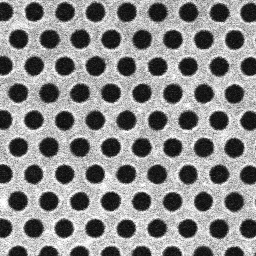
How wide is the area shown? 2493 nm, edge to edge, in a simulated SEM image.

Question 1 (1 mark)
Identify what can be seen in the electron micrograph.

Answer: a regular array of holes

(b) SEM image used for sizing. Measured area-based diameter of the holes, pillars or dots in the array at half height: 0.193 micrometres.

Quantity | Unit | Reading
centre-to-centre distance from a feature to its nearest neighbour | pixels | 30.6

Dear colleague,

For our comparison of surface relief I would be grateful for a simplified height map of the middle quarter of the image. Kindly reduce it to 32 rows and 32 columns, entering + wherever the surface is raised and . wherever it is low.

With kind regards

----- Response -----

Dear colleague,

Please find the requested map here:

...++......++.....+++.....+++...
..++++....+++.....+++.....+++...
..++++....++++...+++++...++++...
++++++++++++++++++++++++++++++++
++++++++++++++++++++++++++++++++
++....++++....++++...+++++...+++
++....+++.....+++.....+++....+++
+.....+++.....+++.....+++.....++
++....++++....+++.....+++....+++
+++..++++++..+++++..++++++..++++
++++++++++++++++++++++++++++++++
++++++++++++++++++++++++++++++++
..++++....++++...+++++...++++...
..+++.....+++.....+++.....+++...
...++.....+++.....+++.....++....
..++++....+++.....+++....++++...
.++++++..+++++...+++++..++++++..
++++++++++++++++++++++++++++++++
+++..++++++..++++++.++++++..++++
++....++++....+++.....+++....+++
+.....+++.....+++.....+++.....++
++....+++.....+++.....+++.....++
++....++++....++++...++++....+++
++++++++++++++++++++++++++++++++
++++++++++++++++++++++++++++++++
.++++++..+++++...+++++..++++++..
..+++.....+++.....+++....++++...
...++.....+++.....+++.....++....
..+++.....+++.....+++.....+++...
..++++...+++++...+++++...++++...
++++++++++++++++++++++++++++++++
++++++++++++++++++++++++++++++++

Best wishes